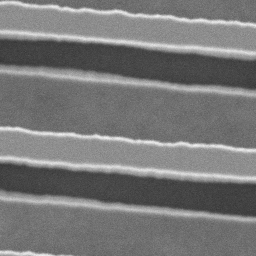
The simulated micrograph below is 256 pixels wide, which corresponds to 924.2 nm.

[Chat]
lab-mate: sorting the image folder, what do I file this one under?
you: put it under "lines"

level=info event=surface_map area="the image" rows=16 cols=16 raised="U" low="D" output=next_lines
UUUUUUUUUUUUUUUU
UUUUUUUUUUUUUUUU
DDDDDDUUUUUUUUUU
DDDDDDDDDDDDDDDD
UUDDDDDDDDDDDDDD
UUUUUUUUUUUUDDDD
UUUUUUUUUUUUUUUU
UUUUUUUUUUUUUUUU
UUUUUUUUUUUUUUUU
UUUUUUUUUUUUUUUU
DDDDDDUUUUUUUUUU
DDDDDDDDDDDDDDDD
UUDDDDDDDDDDDDDD
UUUUUUUUUUUUUUDD
UUUUUUUUUUUUUUUU
UUUUUUUUUUUUUUUU